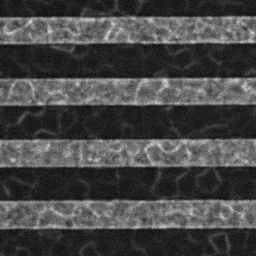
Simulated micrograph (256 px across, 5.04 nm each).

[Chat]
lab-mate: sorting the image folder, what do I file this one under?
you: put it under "one or a few lines or trenches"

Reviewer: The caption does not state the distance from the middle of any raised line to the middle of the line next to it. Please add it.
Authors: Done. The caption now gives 309 nanometers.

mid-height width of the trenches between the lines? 183 nanometers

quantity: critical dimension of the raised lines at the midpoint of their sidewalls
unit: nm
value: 127